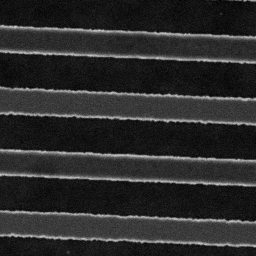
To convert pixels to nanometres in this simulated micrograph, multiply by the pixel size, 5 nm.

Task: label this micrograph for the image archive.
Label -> lines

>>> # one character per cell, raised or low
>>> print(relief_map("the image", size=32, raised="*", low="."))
................................
................................
................................
******..........................
*****************************...
********************************
********************************
......................**********
................................
................................
................................
***********.....................
********************************
********************************
.......*************************
...............................*
................................
................................
................................
********************............
********************************
********************************
.............*******************
................................
................................
................................
***.............................
****************************....
********************************
..******************************
.........................*******
................................